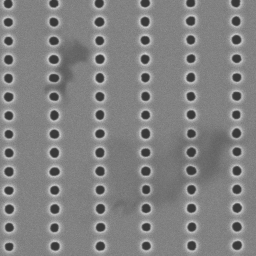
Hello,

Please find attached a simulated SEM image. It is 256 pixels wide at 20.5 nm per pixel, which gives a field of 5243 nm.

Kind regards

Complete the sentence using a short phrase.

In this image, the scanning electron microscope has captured a regular array of holes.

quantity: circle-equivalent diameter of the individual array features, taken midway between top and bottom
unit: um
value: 0.192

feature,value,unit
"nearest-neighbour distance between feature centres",0.377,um